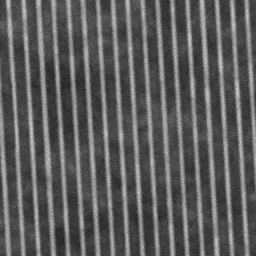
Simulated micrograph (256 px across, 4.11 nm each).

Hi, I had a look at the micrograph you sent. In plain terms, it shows parallel lines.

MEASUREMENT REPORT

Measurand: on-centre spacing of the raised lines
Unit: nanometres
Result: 61.1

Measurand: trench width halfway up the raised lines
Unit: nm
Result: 48.7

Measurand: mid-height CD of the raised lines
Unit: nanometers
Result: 13.3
